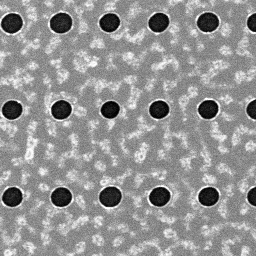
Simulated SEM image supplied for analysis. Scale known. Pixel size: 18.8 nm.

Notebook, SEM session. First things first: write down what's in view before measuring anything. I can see a regular array of holes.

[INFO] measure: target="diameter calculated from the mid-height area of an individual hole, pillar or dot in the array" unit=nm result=390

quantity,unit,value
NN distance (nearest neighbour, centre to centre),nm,921